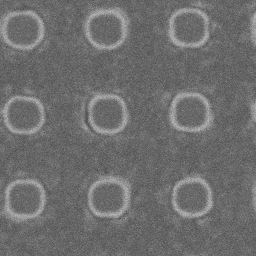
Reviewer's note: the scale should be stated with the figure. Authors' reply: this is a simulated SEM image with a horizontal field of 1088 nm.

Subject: a regular array of raised bodies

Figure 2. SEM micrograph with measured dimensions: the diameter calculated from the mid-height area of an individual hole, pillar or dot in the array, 164 nanometres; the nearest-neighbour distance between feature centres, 0.355 um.